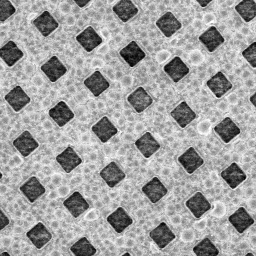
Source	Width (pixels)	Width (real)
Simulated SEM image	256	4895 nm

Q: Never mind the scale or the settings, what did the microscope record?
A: a regular array of holes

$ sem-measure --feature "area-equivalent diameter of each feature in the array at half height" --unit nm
448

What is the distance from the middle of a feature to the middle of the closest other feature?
871 nanometers